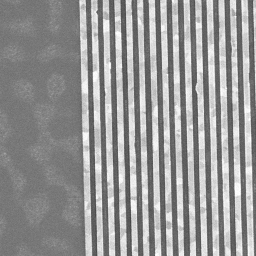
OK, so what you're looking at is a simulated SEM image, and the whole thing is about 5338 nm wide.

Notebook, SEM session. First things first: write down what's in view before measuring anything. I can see parallel lines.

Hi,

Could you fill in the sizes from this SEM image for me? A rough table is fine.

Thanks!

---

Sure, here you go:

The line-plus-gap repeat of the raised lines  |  241 nm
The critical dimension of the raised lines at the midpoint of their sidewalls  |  0.109 microns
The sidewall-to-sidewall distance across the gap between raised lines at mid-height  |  128 nm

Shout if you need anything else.